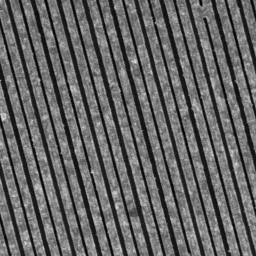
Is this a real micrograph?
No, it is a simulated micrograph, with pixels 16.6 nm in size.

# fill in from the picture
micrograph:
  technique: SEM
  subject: parallel lines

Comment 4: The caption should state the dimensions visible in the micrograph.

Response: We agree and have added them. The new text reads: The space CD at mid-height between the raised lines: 3.99 pixels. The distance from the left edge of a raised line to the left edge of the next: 206 nm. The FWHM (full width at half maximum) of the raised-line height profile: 130 nm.